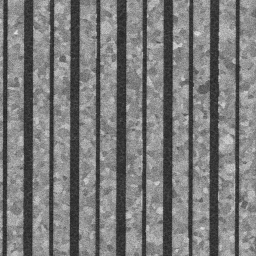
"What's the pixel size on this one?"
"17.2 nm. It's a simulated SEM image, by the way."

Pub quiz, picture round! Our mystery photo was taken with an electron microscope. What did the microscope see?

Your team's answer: parallel lines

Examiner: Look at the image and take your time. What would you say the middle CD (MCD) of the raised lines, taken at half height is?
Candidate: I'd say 0.282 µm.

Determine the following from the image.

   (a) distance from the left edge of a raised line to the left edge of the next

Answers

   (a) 404 nm